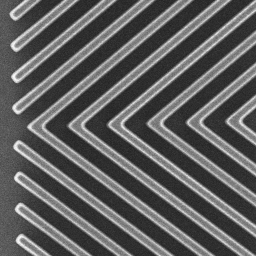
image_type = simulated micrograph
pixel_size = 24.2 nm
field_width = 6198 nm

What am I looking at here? groups of lines, slits or small figures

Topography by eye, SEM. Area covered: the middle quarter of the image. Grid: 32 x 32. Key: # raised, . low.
###......####......###......####
##......###......####......###..
#......###......####......###...
.....####......###......####....
....####......###......####.....
...###.......###......####......
..###......####......###......##
.###......####......###......###
###......###......####......###.
##......###......####......###..
#......###......####......###...
.....####......###......####....
....####......###......####.....
...###......####......####......
..###......####......####......#
.####......####......####......#
..####......####......####......
...####......####.......###.....
.....###.......####......####...
......####......####......####..
#......####......####.......###.
##.......####......####......###
###.......####......####......##
.####......####......####.......
..####.......###.......####.....
....###.......####......####....
.....####......####.......###...
......####.......###.......####.
#.......###.......####......####
###......####......####.......##
####......####.......###.......#
..###.......####......####......